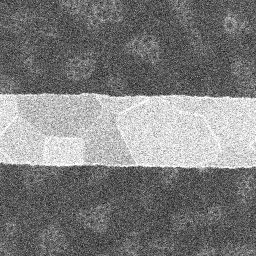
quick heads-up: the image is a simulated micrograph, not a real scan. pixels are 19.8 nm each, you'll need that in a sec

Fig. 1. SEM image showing one or a few lines or trenches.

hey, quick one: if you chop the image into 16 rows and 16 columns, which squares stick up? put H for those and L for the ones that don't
LLLLLLLLLLLLLLLL
LLLLLLLLLLLLLLHL
LLLLLLLLLLLLLLLL
LLLLLLLLLLLLLLLL
LLLLLLLLLLLLLLLL
LLLLLLLLLLLLLLLL
HHHHHHHHHHHHHHHH
HHHHHHHHHHHHHHHH
HHHHHHHHHHHHHHHH
HHHHHHHHHHHHHHHH
LLLLLLLLLLLLLLLL
LLLLLLLLLLLLLLLL
LLLLLLLLLLLLLLLL
LLLLLLLLLLLLLLLL
LLLLLLLLLLLLLLLL
LLLLLLLLLLLLLLLL